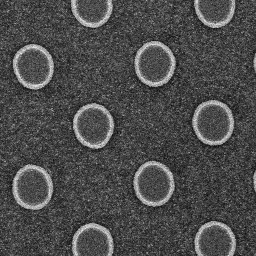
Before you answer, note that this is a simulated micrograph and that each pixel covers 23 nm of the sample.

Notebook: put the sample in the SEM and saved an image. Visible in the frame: raised bodies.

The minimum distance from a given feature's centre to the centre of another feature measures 1920 nm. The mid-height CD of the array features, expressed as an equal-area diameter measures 910 nm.